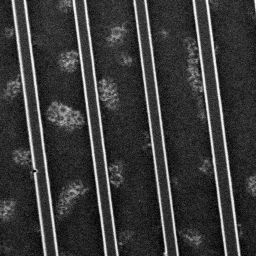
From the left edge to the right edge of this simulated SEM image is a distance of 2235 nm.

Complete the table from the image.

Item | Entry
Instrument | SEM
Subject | parallel lines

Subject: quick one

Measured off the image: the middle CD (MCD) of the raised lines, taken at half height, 102 nm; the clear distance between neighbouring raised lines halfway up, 422 nanometres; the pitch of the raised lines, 524 nanometers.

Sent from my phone